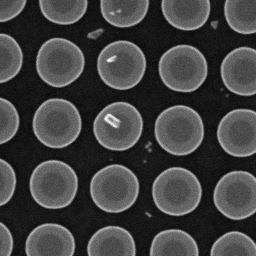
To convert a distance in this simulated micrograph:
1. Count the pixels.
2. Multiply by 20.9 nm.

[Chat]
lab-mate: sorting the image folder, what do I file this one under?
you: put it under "an array of small figures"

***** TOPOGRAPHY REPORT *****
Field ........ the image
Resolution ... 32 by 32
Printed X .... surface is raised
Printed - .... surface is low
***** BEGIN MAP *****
XXX--XXXXXX--XXXXXX-XXXXXX--XXXX
XXX--XXXXXX--XXXXX--XXXXXX--XXXX
X-----XXXX---XXXXX---XXXXX--XXXX
----------------------XXX----XXX
X-------------------------------
XX---XXXX-----XXX---------------
XXX--XXXXX---XXXXX---XXXX----XXX
XXX--XXXXX--XXXXXX--XXXXXX--XXXX
XXX--XXXXX--XXXXXX--XXXXXX--XXXX
XX---XXXXX---XXXXX--XXXXXX--XXXX
------XXX----XXXX----XXXX---XXXX
-----------------------------XXX
X-----XX------------------------
XX---XXXX----XXXX----XXX--------
XX--XXXXXX--XXXXXX--XXXXX---XXXX
XX--XXXXXX--XXXXXX-XXXXXX--XXXXX
XX--XXXXXX--XXXXXX-XXXXXX--XXXXX
X----XXXX---XXXXX---XXXXX--XXXXX
-------------XXX----XXXXX---XXXX
-----------------------------XX-
X----XXX------------------------
XX--XXXXX---XXXX----XXXX-----XX-
XX--XXXXXX-XXXXXX--XXXXXX---XXXX
XX--XXXXXX-XXXXXX--XXXXXX--XXXXX
X---XXXXX--XXXXXX--XXXXXX--XXXXX
-----XXXX---XXXXX--XXXXXX--XXXXX
--------------X-----XXXX----XXXX
--------------------------------
X----XXX-----XX-----------------
X---XXXXX---XXXX----XXXX----XXX-
XX-XXXXXX--XXXXXX--XXXXXX--XXXXX
X--XXXXXX--XXXXXX--XXXXXX-XXXXXX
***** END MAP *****